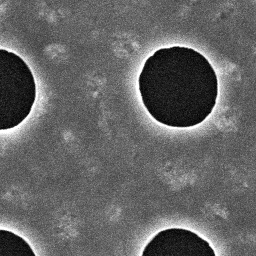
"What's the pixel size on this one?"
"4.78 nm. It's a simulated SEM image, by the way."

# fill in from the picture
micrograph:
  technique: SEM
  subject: holes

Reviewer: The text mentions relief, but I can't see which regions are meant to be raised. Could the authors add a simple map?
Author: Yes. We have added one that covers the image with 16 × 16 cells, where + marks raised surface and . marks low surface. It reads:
++++++++++++++++
++++++++++++++++
++++++++++++++++
.++++++++....+++
..+++++++....+++
..+++++++.....++
..+++++++....+++
.+++++++++...+++
++++++++++++++++
++++++++++++++++
++++++++++++++++
++++++++++++++++
++++++++++++++++
++++++++++++++++
.+++++++++..++++
..+++++++....+++